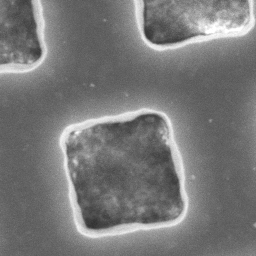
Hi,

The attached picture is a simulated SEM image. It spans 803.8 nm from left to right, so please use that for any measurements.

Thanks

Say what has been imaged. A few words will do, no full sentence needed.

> holes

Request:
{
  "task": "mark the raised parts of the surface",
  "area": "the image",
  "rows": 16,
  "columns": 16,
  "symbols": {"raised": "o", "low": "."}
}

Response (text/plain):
..ooooooo.......
..ooooooo......o
...oooooo...oooo
...ooooooooooooo
oooooooooooooooo
oooooooooooooooo
oooooooooooooooo
ooooooo...oooooo
oooo.......ooooo
oooo.......ooooo
oooo.......ooooo
oooo.......ooooo
ooooo......ooooo
ooooo......ooooo
oooooo.ooooooooo
oooooooooooooooo